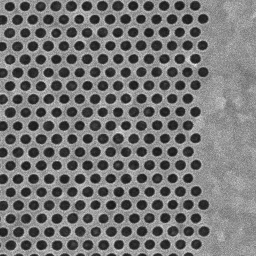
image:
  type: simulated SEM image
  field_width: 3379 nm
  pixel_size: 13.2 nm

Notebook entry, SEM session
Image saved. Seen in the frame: a regular array of holes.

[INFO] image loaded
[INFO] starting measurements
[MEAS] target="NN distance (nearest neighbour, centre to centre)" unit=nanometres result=198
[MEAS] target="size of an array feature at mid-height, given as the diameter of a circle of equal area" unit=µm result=0.141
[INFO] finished